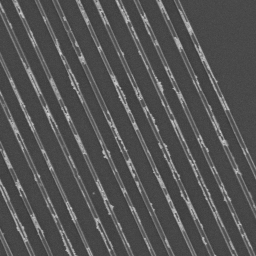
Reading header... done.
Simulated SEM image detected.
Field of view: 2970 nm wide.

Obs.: parallel lines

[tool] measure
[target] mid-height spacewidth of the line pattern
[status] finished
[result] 152 nm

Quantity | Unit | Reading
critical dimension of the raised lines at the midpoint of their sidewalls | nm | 50.1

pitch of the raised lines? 212 nm